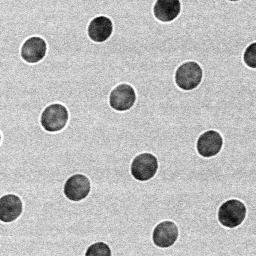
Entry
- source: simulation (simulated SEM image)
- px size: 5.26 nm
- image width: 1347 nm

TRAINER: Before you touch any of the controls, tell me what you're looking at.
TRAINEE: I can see a regular array of holes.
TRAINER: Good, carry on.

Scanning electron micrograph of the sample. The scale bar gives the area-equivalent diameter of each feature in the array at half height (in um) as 0.146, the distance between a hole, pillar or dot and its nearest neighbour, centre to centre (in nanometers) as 367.